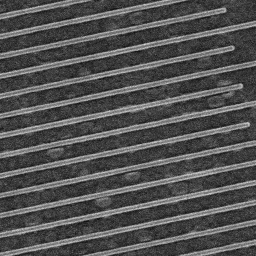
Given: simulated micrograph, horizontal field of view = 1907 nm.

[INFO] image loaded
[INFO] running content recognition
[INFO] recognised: parallel lines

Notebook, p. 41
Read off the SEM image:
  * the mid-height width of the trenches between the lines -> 114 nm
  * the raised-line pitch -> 145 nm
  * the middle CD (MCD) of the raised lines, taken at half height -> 30.1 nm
